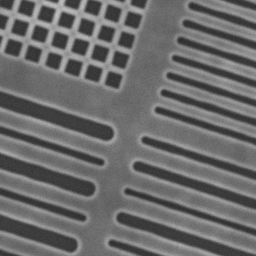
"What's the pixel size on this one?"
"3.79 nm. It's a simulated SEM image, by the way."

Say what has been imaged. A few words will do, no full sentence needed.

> groups of lines, slits or small figures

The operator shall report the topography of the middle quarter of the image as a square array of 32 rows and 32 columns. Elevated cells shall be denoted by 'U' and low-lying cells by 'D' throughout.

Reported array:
DDDDDUDDUUUUUDDDUUUUUUUUUUUUUUUD
DDDDUUDDDDUUUUUUUUUUUUUUUUUUUUUU
UDDDUDDDDUUDDDUUUUUUUUUUUUDDUUUU
UUUUUDDDDUDDDDDUUUUUUUUUUUDDDDDD
UUUUUUUDDUDDDDUUUUUUUUUUUUUUDDDD
UUUUUUUUUUUDDDUUUUUUUUUUUUUUUUUD
UUUUUUUUUUUUUUUUUUUUUUUUDDUUUUUU
UUUUUUUUUUUUUUUUUUUUUUUUDDDDDUUU
UUUUUUUUUUUUUUUUUUUUUUUUUUDDDDDD
UUUUUUUUUUUUUUUUUUUUUUUUUUUUUDDD
UUUUUUUUUUUUUUUUUUUUUUUUUUUUUUUU
UUUUUUUUUUUUUUUUUUUUUUUDDDDUUUUU
DDUUUUUUUUUUUUUUUUUUUUUDDDDDDUUU
DDDDDUUUUUUUUUUUUUUUUUUUUUUDDDDD
DDDDDDDDDUUUUUUUUUUUUUUUUUUUUUDD
DDDDDDDDDDDDUUUUUUUUUUUUUUUUUUUU
UDDDDDDDDDDDUUUUUUUUUUUUUUUUUUUU
UUUUUDDDDDDDDUUUUUUUUUUUUUUUUUUU
UUUUUUUDDDDDUUUUUUUDDDUUUUUUUUUU
UUUUUUUUUUUUUUUUUUUDDDDDDUUUUUUU
UUUUUUUUUUUUUUUUUUUUUDDDDDDDDUUU
DDDUUUUUUUUUUUUUUUUUUUUUDDDDDDDD
DDDDDDUUUUUUUUUUUUUUUUUUUUUDDDDD
UUUDDDDDDUUUUUUUUUUUUUUUUUUUUUUD
UUUUUUDDDDUUUUUUUUDDUUUUUUUUUUUU
UUUUUUUUUUUUUUUUUDDDDDUUUUUUUUUU
UUUUUUUUUUUUUUUUUUDDDDDDDDUUUUUU
DUUUUUUUUUUUUUUUUUUUDDDDDDDDDUUU
DDDDUUUUUUUUUUUUUUUUUUUDDDDDDDDD
DDDDDDDUUUUUUUUUUUUUUUUUUUDDDDDD
DDDDDDDDUUUUUUUUUUUUUUUUUUUUUDDD
DDDDDDDDUUUUUUUDDUUUUUUUUUUUUUUU